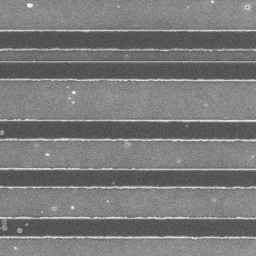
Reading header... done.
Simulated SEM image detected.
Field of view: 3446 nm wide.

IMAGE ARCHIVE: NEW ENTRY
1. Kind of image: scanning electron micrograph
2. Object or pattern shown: lines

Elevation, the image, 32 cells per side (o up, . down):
................................
................................
................................
................................
oooooooooooooooooooooooooooooooo
oooooooooooooooooooooooooooooooo
................................
................................
oooooooooooooooooooooooooooooooo
oooooooooooooooooooooooooooooooo
................................
................................
................................
................................
................................
oooooooooooooooooooooooooooooooo
oooooooooooooooooooooooooooooooo
..............o..o.....oooooo.oo
................................
................................
................................
oooooooooooooooooooooooooooooooo
oooooooooooooooooooooooooooooooo
................................
................................
................................
................................
oooooooooooooooooooooooooooooooo
oooooooooooooooooooooooooooooooo
oooooooooooooooooooooooooooooooo
................................
................................